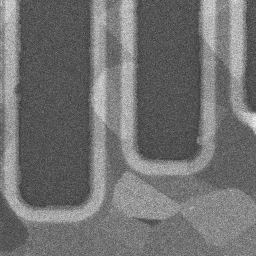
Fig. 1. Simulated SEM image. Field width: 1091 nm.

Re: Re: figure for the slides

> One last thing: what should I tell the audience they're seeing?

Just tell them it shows one or a few lines or trenches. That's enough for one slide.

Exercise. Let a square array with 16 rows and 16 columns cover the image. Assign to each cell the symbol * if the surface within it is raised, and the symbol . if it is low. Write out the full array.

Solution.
*.....**.....**.
*.....**.....**.
*.....**.....**.
*.....**.....**.
*.....**.....**.
*.....**.....**.
*.....**.....**.
*.....**.....***
*.....**.....***
*.....**.....***
*.....***...****
*.....**********
*.....**********
**...***********
****************
****************